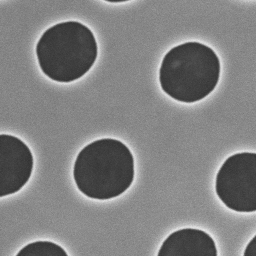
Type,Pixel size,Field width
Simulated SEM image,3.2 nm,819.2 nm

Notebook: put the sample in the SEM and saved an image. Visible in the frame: holes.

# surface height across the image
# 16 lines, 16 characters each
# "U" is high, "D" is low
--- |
UUUUUUUUUUUUUUUU
UUUUDUUUUUUUUUUU
UUDDDDUUUUUUUUUU
UUDDDDUUUUDDDDUU
UUUDDUUUUUDDDDUU
UUUUUUUUUUDDDUUU
UUUUUUUUUUUUUUUU
UUUUUUUUUUUUUUUU
DUUUUUUUUUUUUUUU
DDUUUDDDUUUUUUUU
DDUUUDDDUUUUUUDD
DDUUUDDDUUUUUDDD
UUUUUUUUUUUUUUDD
UUUUUUUUUUUUUUUU
UUUUUUUUUUUDDUUU
UDDDUUUUUUDDDUUD